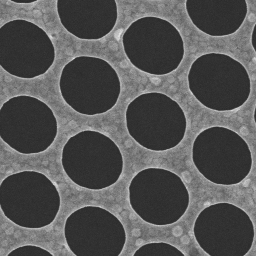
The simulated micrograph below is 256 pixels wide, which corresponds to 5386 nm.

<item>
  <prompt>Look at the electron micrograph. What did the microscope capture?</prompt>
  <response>holes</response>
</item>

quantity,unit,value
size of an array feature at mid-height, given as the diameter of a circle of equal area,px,59.3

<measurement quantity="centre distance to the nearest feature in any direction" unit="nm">1570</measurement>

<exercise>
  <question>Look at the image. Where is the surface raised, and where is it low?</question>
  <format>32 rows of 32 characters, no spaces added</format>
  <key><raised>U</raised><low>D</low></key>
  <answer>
UUUUUUUDDDDDDDDUUUUUUUUDDDDDDDDU
UUUUUUUDDDDDDDDUUUUUUUUDDDDDDDDU
UUDUUUUUDDDDDDDUUDDDDUUUDDDDDDUU
DDDDDUUUDDDDDDUUDDDDDDUUUDDDDDUU
DDDDDDUUUDDDDUUDDDDDDDDUUUUUUUUD
DDDDDDDUUUUUUUUDDDDDDDDUUUUUUUUU
DDDDDDDUUUUUUUUUDDDDDDDUUUUUUUUU
DDDDDDDUUDDDDUUUDDDDDDDUUDDDDUUU
DDDDDDUUDDDDDDUUUDDDDDUUDDDDDDDU
UUDDDUUUDDDDDDDUUUUUUUUUDDDDDDDU
UUUUUUUDDDDDDDDUUUUUUUUUDDDDDDDU
UUUUUUUUDDDDDDDUUUUUUUUUDDDDDDDU
UDDDDUUUDDDDDDDUUDDDDDUUUDDDDDDU
DDDDDDUUUDDDDDUUDDDDDDDUUUDDDDUU
DDDDDDDUUUUUUUUUDDDDDDDUUUUUUUUU
DDDDDDDUUUUUUUUUDDDDDDDUUUUUUUUU
DDDDDDDUUUDDUUUUDDDDDDDUUDDDDUUU
DDDDDDDUUDDDDDUUUDDDDDDUDDDDDDUU
UUDDDDUUDDDDDDDUUUDDDUUUDDDDDDDU
UUUUUUUUDDDDDDDUUUUUUUUUDDDDDDDU
UUUUUUUUDDDDDDDUUUUUUUUUDDDDDDDU
UUUDDUUUDDDDDDDUUDDDDUUUUDDDDDDU
DDDDDDUUUDDDDDDUUDDDDDDUUUDDDDUU
DDDDDDDUUUUDDUUUDDDDDDDUUUUUUUUU
DDDDDDDUUUUUUUUUDDDDDDDDUUUUUUUU
DDDDDDDUUUUUUUUUDDDDDDDDUUUDDUUU
DDDDDDDUUDDDDDUUUDDDDDDUUDDDDDDU
UDDDDDDUDDDDDDDUUUDDDDUUUDDDDDDU
UUUUUUUUDDDDDDDUUUUUUUUUDDDDDDDD
UUUUUUUUDDDDDDDDUUUUUUUUDDDDDDDD
UUUUUUUUDDDDDDDDUUDDDUUUUDDDDDDU
UDDDDDUUUDDDDDDUUDDDDDDUUUDDDDDU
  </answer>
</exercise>